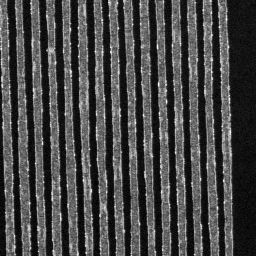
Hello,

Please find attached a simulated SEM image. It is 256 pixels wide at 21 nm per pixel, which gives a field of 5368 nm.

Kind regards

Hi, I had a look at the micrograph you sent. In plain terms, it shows parallel lines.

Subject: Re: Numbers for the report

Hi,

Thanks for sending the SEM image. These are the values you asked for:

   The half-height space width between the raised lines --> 176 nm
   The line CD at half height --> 152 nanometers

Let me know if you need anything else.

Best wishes